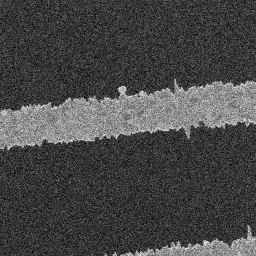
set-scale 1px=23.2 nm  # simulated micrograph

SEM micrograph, one or a few lines or trenches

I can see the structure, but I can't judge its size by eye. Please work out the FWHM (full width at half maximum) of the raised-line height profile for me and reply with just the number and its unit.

37.6 px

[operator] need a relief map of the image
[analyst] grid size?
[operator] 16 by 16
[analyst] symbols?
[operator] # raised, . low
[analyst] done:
................
................
................
................
................
............####
....############
################
#######.........
................
................
................
................
................
................
..........######